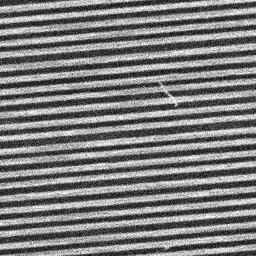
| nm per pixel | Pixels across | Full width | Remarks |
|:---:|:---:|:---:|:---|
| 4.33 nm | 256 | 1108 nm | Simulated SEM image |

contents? parallel lines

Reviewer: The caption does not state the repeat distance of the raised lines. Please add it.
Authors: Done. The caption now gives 51.1 nm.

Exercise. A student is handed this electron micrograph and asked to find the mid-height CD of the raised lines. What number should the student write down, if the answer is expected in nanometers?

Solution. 22.1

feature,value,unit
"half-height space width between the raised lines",29.1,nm